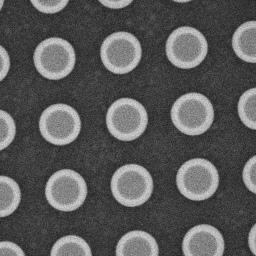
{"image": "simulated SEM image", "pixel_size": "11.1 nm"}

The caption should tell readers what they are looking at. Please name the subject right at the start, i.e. an array of small figures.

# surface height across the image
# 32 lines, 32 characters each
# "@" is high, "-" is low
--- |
----@@@@-----@@@----------------
-----@@-------------------------
--------------------------------
----------------------@@------@@
--------------@@@----@@@@----@@@
-----@@@@----@@@@----@@@@@---@@@
@---@@@@@----@@@@@---@@@@@---@@@
@---@@@@@----@@@@----@@@@-----@@
@----@@@@----@@@@------@--------
@----@@@------------------------
--------------------------------
-------------------------------@
---------------@@-----@@@@----@@
------@@@-----@@@@----@@@@@---@@
@----@@@@@---@@@@@---@@@@@@---@@
@@---@@@@@---@@@@@----@@@@-----@
@@---@@@@@----@@@@-----@@-------
@@----@@@------@----------------
@-------------------------------
--------------------------------
-----------------------@@@-----@
-------@@-----@@@@----@@@@@---@@
@@----@@@@----@@@@@---@@@@@---@@
@@----@@@@@---@@@@@---@@@@@----@
@@@---@@@@@---@@@@@----@@@------
@@----@@@@-----@@@--------------
@@------------------------------
--------------------------------
------------------------@@@-----
--------@@-----@@@@----@@@@@---@
@@-----@@@@----@@@@@---@@@@@---@
@@@---@@@@@----@@@@@---@@@@@----